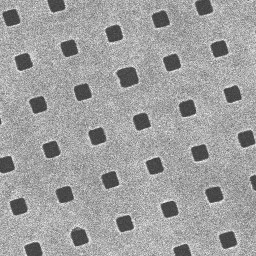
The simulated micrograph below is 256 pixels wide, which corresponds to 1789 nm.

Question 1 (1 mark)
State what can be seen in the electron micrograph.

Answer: a regular array of holes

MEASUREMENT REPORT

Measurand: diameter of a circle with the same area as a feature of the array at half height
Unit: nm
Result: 120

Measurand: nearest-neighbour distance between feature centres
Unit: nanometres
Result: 320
